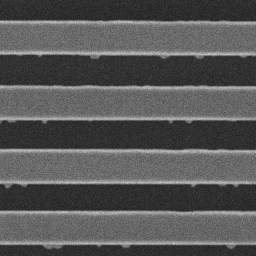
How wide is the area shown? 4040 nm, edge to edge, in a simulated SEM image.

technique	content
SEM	lines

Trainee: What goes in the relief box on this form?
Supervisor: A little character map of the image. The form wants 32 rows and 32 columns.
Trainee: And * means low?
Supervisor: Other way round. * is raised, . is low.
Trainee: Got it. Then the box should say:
................................
................................
................................
********************************
********************************
********************************
********************************
................................
................................
................................
................................
********************************
********************************
********************************
********************************
................................
................................
................................
................................
********************************
********************************
********************************
********************************
................................
................................
................................
**********************..********
********************************
********************************
********************************
********************************
................................